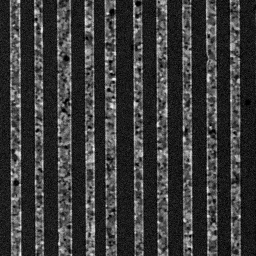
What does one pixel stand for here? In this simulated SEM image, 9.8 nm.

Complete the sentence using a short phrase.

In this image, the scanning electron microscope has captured parallel lines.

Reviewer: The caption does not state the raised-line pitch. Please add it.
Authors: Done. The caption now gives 24.5 px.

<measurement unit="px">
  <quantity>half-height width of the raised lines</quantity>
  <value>9.13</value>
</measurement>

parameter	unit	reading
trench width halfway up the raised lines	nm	147